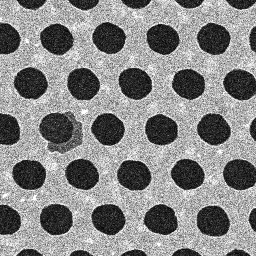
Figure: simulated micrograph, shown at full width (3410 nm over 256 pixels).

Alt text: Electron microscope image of a regular array of holes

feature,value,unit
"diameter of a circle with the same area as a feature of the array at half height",435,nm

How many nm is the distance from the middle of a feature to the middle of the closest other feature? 688